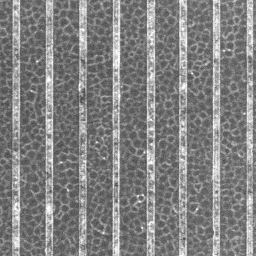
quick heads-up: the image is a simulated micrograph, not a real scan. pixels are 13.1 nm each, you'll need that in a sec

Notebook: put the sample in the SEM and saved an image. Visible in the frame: parallel lines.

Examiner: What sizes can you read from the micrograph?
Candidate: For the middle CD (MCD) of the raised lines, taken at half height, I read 0.0866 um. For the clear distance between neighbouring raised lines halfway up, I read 350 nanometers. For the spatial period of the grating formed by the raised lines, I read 436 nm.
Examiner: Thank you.